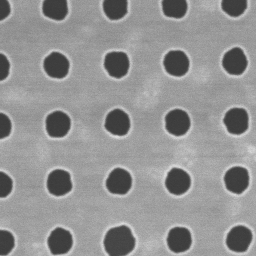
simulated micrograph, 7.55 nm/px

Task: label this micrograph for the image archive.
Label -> a regular array of holes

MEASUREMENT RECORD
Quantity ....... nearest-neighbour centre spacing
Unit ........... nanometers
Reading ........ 441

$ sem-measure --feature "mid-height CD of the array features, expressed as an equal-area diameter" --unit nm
196